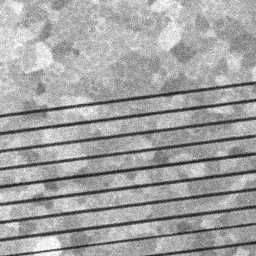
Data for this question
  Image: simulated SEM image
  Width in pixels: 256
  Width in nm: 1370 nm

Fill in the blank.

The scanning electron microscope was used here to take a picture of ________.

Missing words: parallel lines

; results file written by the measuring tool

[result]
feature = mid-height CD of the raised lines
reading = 72.9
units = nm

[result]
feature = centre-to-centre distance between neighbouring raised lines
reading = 93.9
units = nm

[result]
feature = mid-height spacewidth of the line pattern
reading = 3.72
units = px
